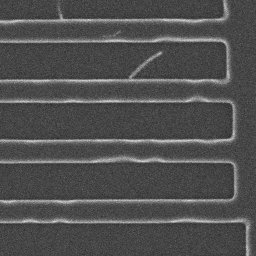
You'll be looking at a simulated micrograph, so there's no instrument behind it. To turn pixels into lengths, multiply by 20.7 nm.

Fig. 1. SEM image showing groups of lines, slits or small figures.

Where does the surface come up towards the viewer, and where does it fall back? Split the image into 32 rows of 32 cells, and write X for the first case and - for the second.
----------------------------XXXX
----------------------------XXXX
--------XX-XXXXXXXXXXXX--XXXXXXX
XXXXXXXXXXXXXXXXXXXXXXXXXXXXXXXX
XXXXXXXXXXXXXXXXXXXXXXXXXXXXXXXX
----------------------------XXXX
----------------------------XXXX
----------------------------XXXX
----------------------------XXXX
----------------------------XXXX
XXXXXXXXXXXXXXXXXXXXXXXXXXXXXXXX
XXXXXXXXXXXXXXXXXXXXXXXXXXXXXXXX
XXXXXXXXXXXXXXXXXXXXXXXXXXXXXXXX
-----------------------------XXX
-----------------------------XXX
-----------------------------XXX
-----------------------------XXX
----------------------------XXXX
XXXXXXXXXXXXXXXXXXXXXXXXXXXXXXXX
XXXXXXXXXXXXXXXXXXXXXXXXXXXXXXXX
-----------------------------XXX
-----------------------------XXX
-----------------------------XXX
-----------------------------XXX
-----------------------------XXX
XXXXXXXXXXXXXXXXXXXXXXXXXXXXXXXX
XXXXXXXXXXXXXXXXXXXXXXXXXXXXXXXX
XXXXXXXXXXXXXXXXXXXXXXXXXXXXXXXX
-------------------------------X
-------------------------------X
-------------------------------X
-------------------------------X